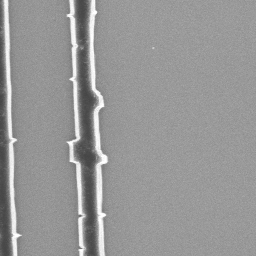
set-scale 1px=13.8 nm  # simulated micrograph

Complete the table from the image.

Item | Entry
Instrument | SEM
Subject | one or a few lines or trenches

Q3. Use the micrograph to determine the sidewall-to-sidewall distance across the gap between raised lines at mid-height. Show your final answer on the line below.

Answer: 0.9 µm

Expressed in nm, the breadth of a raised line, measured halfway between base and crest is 291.